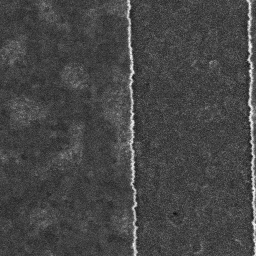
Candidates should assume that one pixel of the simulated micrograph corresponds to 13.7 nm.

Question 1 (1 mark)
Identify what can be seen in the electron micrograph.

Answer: one or a few lines or trenches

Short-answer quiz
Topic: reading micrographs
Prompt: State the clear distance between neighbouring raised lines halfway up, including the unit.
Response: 1630 nm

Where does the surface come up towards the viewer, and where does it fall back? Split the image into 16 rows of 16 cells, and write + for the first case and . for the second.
++++++++........
++++++++........
++++++++........
++++++++........
++++++++........
++++++++........
+.+++++.........
++++++++........
++++++++........
++++++++........
++++++++........
++++++++........
++++++++........
++++++++........
++++++++........
++++++++........